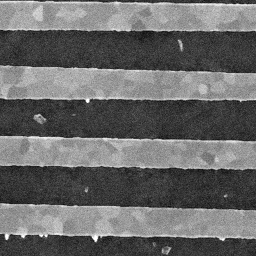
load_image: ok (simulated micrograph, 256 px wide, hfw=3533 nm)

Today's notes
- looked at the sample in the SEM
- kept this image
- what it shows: lines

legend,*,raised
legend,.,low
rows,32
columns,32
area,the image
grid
**********************..........
********************************
********************************
********************************
................................
................................
................................
................................
********.*......................
********************************
********************************
********************************
..............................*.
................................
................................
................................
................................
*****************.**............
********************************
********************************
********************************
................................
................................
................................
................................
................................
********************************
********************************
********************************
...........*.....**..***********
................................
................................